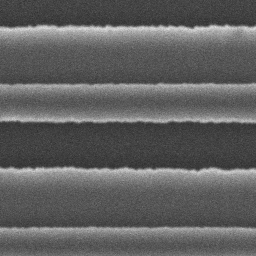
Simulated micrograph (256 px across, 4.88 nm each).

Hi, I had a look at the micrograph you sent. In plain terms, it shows lines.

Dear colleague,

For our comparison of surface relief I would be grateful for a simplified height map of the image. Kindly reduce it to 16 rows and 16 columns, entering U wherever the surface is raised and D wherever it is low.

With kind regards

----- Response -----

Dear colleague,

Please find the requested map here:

DDDDDDDDDDDDDDDD
DDDDDDDDDDDDDDDD
UUUUUUUUUUUUUUUU
UUUUUUUUUUUUUUUU
UUUUUUUUUUUUUUUU
UUUUUUUUUUUUUUUU
UUUUUUUUUUUUUUUU
UUUUUUUUUUUUUUUU
DDDDDDDDDDDDDDDD
DDDDDDDDDDDDDDDD
DDDDDDDDDDDDDDDD
UUUUUUUUUUUUUUUU
UUUUUUUUUUUUUUUU
UUUUUUUUUUUUUUUU
UUUUUUUUUUUUUUUU
UUUUUUUUUUUUUUUU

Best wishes